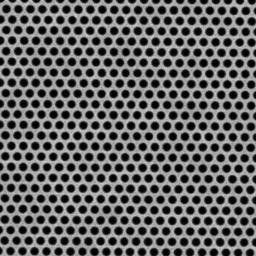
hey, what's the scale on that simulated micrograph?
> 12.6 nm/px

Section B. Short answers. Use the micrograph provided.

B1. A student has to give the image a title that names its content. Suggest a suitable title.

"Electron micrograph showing a regular array of holes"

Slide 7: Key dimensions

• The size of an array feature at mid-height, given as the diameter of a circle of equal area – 0.104 µm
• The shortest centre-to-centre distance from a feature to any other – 148 nm